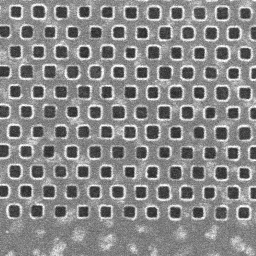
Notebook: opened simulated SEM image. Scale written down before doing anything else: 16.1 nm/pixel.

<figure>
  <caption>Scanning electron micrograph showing a regular array of holes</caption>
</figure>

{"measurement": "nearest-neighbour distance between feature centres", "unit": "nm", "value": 362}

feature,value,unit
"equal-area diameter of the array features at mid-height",212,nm